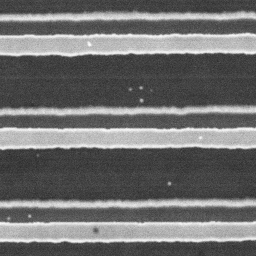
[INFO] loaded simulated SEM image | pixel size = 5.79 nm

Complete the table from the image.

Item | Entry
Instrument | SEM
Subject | lines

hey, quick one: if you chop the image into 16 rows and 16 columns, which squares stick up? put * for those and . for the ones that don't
................
****************
****************
................
................
................
................
****************
****************
................
................
................
................
****************
****************
................